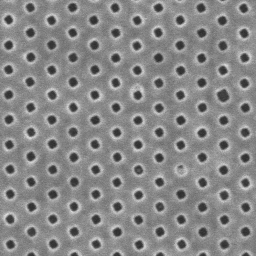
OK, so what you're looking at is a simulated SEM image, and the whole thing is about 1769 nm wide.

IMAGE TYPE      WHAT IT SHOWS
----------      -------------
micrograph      a regular array of holes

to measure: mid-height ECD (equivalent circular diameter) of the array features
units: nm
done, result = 68.4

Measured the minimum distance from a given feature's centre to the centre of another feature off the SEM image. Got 168 nanometres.